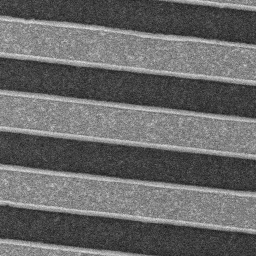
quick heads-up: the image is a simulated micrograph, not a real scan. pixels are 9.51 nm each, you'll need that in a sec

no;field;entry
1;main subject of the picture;one or a few lines or trenches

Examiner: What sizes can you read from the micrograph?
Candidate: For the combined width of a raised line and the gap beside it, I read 702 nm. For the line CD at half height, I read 354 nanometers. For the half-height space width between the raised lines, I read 354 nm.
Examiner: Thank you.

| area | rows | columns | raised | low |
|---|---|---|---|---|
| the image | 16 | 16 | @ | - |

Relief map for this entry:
---------------@
@@@@------------
@@@@@@@@@@@@@---
-@@@@@@@@@@@@@@@
----------@@@@@@
----------------
@@@@@@@---------
@@@@@@@@@@@@@@@@
----@@@@@@@@@@@@
-------------@@@
@---------------
@@@@@@@@@@------
@@@@@@@@@@@@@@@@
-------@@@@@@@@@
----------------
@@@@------------